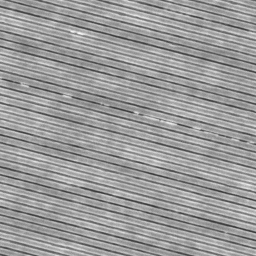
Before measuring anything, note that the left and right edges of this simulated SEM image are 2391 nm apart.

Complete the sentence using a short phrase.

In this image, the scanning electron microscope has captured parallel lines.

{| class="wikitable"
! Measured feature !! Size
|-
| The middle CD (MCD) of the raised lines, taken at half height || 49.7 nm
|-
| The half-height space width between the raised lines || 2.55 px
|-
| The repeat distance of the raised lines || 0.0724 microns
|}